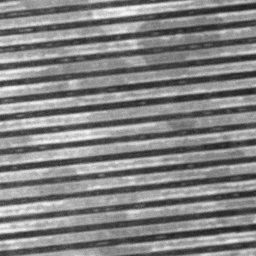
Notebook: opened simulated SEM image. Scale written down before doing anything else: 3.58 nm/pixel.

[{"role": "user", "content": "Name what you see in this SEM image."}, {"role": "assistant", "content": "parallel lines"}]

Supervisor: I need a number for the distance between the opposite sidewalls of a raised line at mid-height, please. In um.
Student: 0.0343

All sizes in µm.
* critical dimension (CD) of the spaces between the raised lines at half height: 0.0285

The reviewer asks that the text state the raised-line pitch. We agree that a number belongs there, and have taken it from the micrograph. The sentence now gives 0.0606 µm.